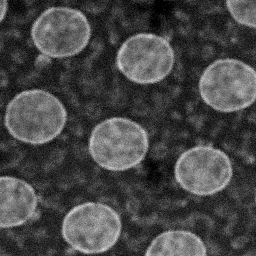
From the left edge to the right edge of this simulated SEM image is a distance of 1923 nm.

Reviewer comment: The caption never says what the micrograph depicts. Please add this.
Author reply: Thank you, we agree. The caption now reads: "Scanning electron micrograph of raised bodies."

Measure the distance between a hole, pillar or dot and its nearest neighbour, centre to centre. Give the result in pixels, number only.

88.1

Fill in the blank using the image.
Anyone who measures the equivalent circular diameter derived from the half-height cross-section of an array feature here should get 394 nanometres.